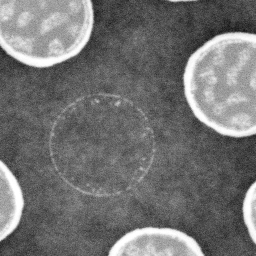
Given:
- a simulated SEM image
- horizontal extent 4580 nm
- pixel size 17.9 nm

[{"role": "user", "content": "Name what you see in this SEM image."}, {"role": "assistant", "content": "raised bodies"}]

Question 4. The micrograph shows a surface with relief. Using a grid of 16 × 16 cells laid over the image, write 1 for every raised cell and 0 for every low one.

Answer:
1111110000000000
1111110000000000
1111100000000111
0111000000001111
0000000000001111
0000000000001111
0000000000001111
0000000000000111
0000000000000000
0000000000000000
0000000000000000
1000000000000000
1000000000000000
1000000000000001
1000000001100000
0000000111110000